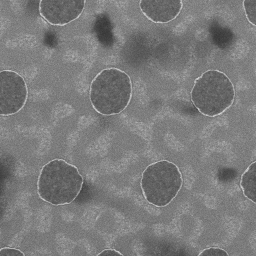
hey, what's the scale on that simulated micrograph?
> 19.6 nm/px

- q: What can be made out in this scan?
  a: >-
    raised bodies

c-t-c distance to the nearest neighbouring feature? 102 px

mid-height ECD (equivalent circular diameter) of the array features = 872 nm